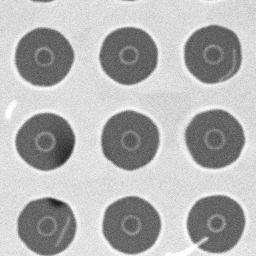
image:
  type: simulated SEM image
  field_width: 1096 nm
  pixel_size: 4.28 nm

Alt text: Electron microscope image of an array of small figures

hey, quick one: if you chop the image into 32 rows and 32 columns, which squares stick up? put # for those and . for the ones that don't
################################
################################
################################
#####.#########...#######...####
###.....#####......#####......##
##.......####.......###.......##
##...#...###...##...###...##..##
##...##..###...##...###...##..##
##.......####.......###.......##
##......#####......#####.....###
####...########..########..#####
################################
################################
################################
####....######.....#####.....###
###......####.......###.......##
##.......####...#...###...##...#
##...##...###..##...###...##...#
##...#...####...#...###...#...##
##.......####......#####......##
###.....######.....#####.....###
################################
################################
################################
################.#########...###
###......#####.....#####......##
###......####.......####.......#
##...##...###..##...###...##...#
##...##...###..##...###...##...#
##.......####.......####......##
###......####......#####......##
####....#######...########..####